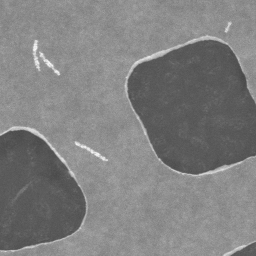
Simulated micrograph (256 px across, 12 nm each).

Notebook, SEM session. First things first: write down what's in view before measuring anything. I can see holes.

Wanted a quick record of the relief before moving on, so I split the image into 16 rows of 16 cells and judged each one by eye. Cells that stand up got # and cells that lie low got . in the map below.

################
################
############..##
##########.....#
########.......#
########........
########........
#########.......
..#######.......
...#######......
....#######...##
.....###########
.....###########
.....###########
.....###########
.##############.